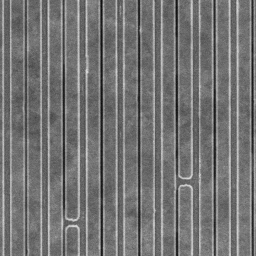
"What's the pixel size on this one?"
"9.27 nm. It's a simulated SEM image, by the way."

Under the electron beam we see parallel lines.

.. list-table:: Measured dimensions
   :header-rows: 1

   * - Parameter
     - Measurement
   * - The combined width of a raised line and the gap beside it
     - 0.175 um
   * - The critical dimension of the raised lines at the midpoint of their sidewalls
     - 0.126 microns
